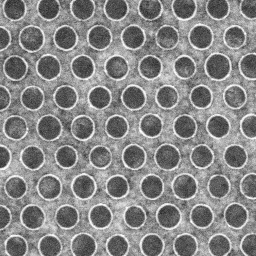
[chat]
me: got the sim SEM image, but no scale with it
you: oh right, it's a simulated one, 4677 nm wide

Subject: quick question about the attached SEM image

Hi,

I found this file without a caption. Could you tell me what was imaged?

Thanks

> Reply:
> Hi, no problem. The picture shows a regular array of raised bodies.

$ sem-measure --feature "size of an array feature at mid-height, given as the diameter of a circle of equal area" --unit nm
435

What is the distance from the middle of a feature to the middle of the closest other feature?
613 nanometers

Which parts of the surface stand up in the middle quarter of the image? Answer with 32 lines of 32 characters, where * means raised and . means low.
..******..******...*****...*****
..******..******...*****....****
..*****....*****...*****....****
...***......***.....***......**.
................................
*...............**..............
***....****....*****....****....
***...******...*****...******...
***...******...*****...******...
***...******...*****...*****....
**.....****.....****....****....
................................
................................
...***.....****.....****....****
..*****....*****...*****....****
..******..******...******...****
..******..******...*****....****
..*****....*****....****....****
...***......**...............***
................................
*...............***.....****....
***....****....*****...*****....
***....*****...*****...******...
***...******...*****...******...
***....*****...*****...******...
**.....****.....****....****....
.........................**.....
................................
...****.....***.....****....****
..******...*****...******..*****
..******...*****...******..*****
..******...*****...******..*****